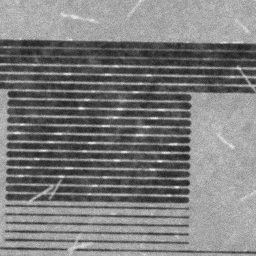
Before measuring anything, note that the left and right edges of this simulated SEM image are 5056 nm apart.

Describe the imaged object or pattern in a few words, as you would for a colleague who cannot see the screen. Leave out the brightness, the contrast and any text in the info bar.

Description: groups of lines, slits or small figures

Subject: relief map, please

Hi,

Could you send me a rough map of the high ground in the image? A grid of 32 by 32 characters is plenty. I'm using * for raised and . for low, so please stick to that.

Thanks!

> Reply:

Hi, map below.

********************************
********************************
********************************
********************************
********************************
................................
................................
................................
................................
................................
................................
*...............................
*.......................********
*.......................********
*.......................********
*.......................********
*.......................********
*.......................********
*.......................********
*.......................********
*.......................********
*.......................********
*.......................********
*.......................********
*.......................********
*****.*.............************
********************************
********************************
********************************
*******************.************
********************************
********************************